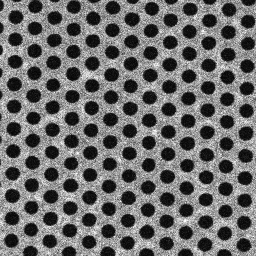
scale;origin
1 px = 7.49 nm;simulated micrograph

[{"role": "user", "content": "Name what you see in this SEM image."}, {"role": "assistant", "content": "a regular array of holes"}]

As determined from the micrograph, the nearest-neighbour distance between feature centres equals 166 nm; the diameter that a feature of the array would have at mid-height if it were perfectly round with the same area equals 0.108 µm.